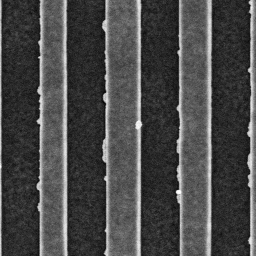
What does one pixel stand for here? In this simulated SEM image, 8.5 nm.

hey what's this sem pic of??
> lines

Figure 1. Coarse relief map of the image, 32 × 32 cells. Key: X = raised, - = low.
-----XXX-----XXXX-----XXXX-----X
-----XXX-----XXXX-----XXXX-----X
-----XXX-----XXXX-----XXXX-----X
-----XXX-----XXXXX----XXXX-----X
-----XXX-----XXXXX----XXXX-----X
-----XXX-----XXXXX----XXXX-----X
-----XXX-----XXXX-----XXXX-----X
-----XXX-----XXXXX----XXXX-----X
-----XXX-----XXXX-----XXXX-----X
-----XXX-----XXXX-----XXXX-----X
-----XXX-----XXXX-----XXXX-----X
-----XXX-----XXXXX----XXXX-----X
-----XXX-----XXXXX----XXXX-----X
-----XXX-----XXXX-----XXXX-----X
-----XXX-----XXXX-----XXXX-----X
-----XXX-----XXXXX----XXXX-----X
-----XXX-----XXXX-----XXXX-----X
-----XXX-----XXXX-----XXXX-----X
-----XXX-----XXXX-----XXXX-----X
-----XXX-----XXXX-----XXXX-----X
-----XXX-----XXXX-----XXXX-----X
-----XXX-----XXXX-----XXXX-----X
-----XXX-----XXXX-----XXXX-----X
-----XXX-----XXXX-----XXXX-----X
-----XXX-----XXXX-----XXXX-----X
-----XXX-----XXXX-----XXXX-----X
-----XXX-----XXXX------XXX-----X
-----XXX-----XXXX------XXX-----X
-----XXX-----XXXX------XXX-----X
-----XXX-----XXXX------XXX-----X
-----XXX-----XXXX------XXX-----X
-----XXX-----XXXX------XXX-----X